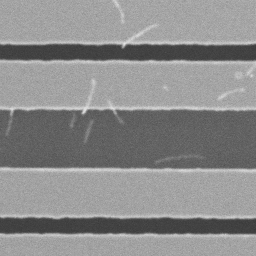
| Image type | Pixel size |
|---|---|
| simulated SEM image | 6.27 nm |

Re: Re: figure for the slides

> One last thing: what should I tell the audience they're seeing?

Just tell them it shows lines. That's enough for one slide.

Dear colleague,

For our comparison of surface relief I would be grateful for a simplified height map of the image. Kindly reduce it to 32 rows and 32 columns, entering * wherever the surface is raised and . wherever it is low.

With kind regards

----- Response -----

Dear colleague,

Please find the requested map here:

********************************
********************************
********************************
********************************
********************************
*******...**********************
................................
*........*....*.................
********************************
********************************
********************************
********************************
********************************
********************************
................................
................................
................................
................................
................................
................................
................................
********************************
********************************
********************************
********************************
********************************
********************************
................................
................................
********************************
********************************
********************************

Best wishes